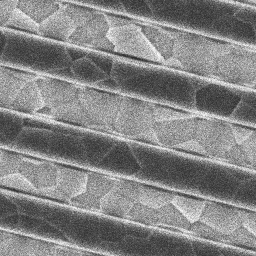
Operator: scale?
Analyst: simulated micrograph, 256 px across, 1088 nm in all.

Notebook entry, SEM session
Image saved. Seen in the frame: one or a few lines or trenches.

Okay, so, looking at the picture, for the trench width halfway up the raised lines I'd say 174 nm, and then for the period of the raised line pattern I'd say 338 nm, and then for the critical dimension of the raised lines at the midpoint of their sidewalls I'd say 163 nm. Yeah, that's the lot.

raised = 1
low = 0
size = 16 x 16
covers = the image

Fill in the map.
0000001111111111
0000000000111111
1110000000000011
1111111000000000
0011111111100000
0000001111111110
0000000000111111
1110000000000011
1111111000000000
0111111111100000
0000011111111110
0000000001111111
1110000000000111
1111111000000000
0111111111100000
0000011111111110